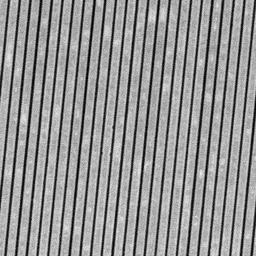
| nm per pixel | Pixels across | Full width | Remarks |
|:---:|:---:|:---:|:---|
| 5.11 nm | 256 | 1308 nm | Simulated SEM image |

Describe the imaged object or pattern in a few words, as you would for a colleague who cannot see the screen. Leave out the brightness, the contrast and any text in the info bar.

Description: parallel lines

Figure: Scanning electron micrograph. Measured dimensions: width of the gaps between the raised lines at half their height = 14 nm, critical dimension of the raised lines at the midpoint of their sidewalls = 0.0368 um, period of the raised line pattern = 54.4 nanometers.